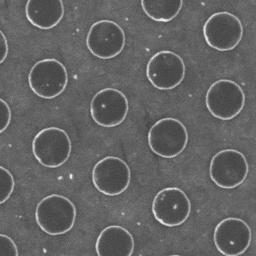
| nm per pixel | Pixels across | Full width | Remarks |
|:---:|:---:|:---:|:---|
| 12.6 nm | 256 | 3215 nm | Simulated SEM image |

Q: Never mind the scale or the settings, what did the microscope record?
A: a regular array of raised bodies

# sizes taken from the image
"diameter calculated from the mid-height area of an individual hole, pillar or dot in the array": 38.2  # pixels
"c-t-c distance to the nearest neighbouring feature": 839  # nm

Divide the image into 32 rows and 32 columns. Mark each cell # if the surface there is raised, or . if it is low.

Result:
...#####..........#####.........
...#####..........####..........
....###............##.....####..
.....#.....####...........####..
...........####...........####..
#..........####...........####..
#...........###.....#...........
......#............####.........
....####..........#####.........
....####..........#####.........
....####...........###.....##...
....####....###...........####..
............####..........####..
#..........#####..........####..
#...........####...........##...
#...........###....####.........
.....###...........####.........
....#####..........####.........
....#####..........####.........
....#####...........##.....###..
.....###....####..........#####.
#...........####..........#####.
##..........####...........####.
##..........####................
#.....#.............###.........
.....####..........#####........
.....####..........#####........
.....####...........###.....##..
.....####....##............####.
#...........####...........####.
##..........#####..........####.
##..........####............##..